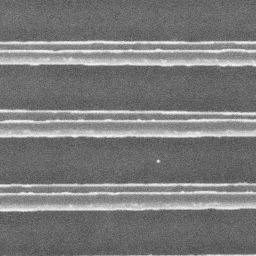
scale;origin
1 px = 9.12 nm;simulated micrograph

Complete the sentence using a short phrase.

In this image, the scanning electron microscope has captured lines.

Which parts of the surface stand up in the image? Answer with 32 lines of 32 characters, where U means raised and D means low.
DDDDDDDDDDDDDDDDDDDDDDDDDDDDDDDD
DDDDDDDDDDDDDDDDDDDDDDDDDDDDDDDD
DDDDDDDDDDDDDDDDDDDDDDDDDDDDDDDD
DDDDDDDDDDDDDDDDDDDDDDDDDDDDDDDD
DDDDDDDDDDDDDDDDDDDDDDDDDDDDDDDD
UUUUUUUUUUUUUUUUUUUUUUUUUUUUUUUU
UUUUUUUUUUUUUUUUUUUUUUUUUUUUUUUU
UUUUUUUUUUUUUUUUUUUUUUUUUUUUUUUU
DDDDDDDDDDDDDDDDDDDDDDDDDDDDDDDD
DDDDDDDDDDDDDDDDDDDDDDDDDDDDDDDD
DDDDDDDDDDDDDDDDDDDDDDDDDDDDDDDD
DDDDDDDDDDDDDDDDDDDDDDDDDDDDDDDD
DDDDDDDDDDDDDDDDDDDDDDDDDDDDDDDD
DDDDDDDDDDDDDDDDDDDDDDDDDDDDDDDD
UUUUUUUUUUUUUUUUUUUUUUUUUUUUUUUU
UUUUUUUUUUUUUUUUUUUUUUUUUUUUUUUU
UUUUUUUUUUUUUUUUUUUUUUUUUUUUUUUU
DDDDDDDDDDDDDDDDDDDDDDDDDDDDDDDD
DDDDDDDDDDDDDDDDDDDDDDDDDDDDDDDD
DDDDDDDDDDDDDDDDDDDDDDDDDDDDDDDD
DDDDDDDDDDDDDDDDDDDDDDDDDDDDDDDD
DDDDDDDDDDDDDDDDDDDDDDDDDDDDDDDD
DDDDDDDDDDDDDDDDDDDDDDDDDDDDDDDD
UUUUUUUUUUUUUUUUUUUUUUUUUUUUUUUU
UUUUUUUUUUUUUUUUUUUUUUUUUUUUUUUU
UUUUUUUUUUUUUUUUUUUUUUUUUUUUUUUU
DDDDDDDDDDDDDDDDDDDDDDDDDDDDDDDD
DDDDDDDDDDDDDDDDDDDDDDDDDDDDDDDD
DDDDDDDDDDDDDDDDDDDDDDDDDDDDDDDD
DDDDDDDDDDDDDDDDDDDDDDDDDDDDDDDD
DDDDDDDDDDDDDDDDDDDDDDDDDDDDDDDD
DDDDDDDDDDDDDDDDDDDDDDDDDDDDDDDD